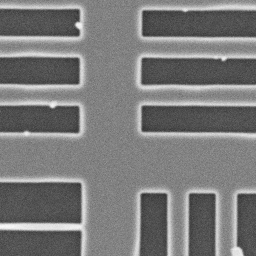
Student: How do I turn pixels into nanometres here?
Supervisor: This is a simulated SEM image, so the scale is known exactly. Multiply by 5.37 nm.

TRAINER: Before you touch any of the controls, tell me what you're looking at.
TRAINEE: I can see groups of lines, slits or small figures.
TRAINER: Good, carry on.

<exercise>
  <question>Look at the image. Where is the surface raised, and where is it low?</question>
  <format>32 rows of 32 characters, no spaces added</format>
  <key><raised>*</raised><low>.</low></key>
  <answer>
********************************
..........********..............
..........********..............
..........********..............
..........********..............
********************************
********************************
..........********..............
..........*******...............
..........*******...............
..........********..............
********************************
********************************
..........********..............
..........********..............
..........********..............
..........********..............
********************************
********************************
********************************
********************************
********************************
********************************
..........**********************
..........********...***...***..
..........*******....**....***..
..........*******....**....***..
..........*******....**....***..
*****************....**....***..
..........*******....**....***..
..........*******....**....***..
..........*******....**....***..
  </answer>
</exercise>